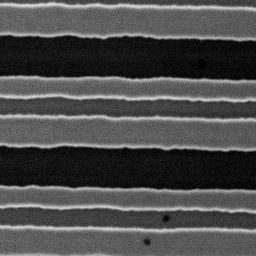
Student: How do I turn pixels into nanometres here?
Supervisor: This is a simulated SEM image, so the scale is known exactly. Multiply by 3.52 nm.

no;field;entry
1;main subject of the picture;lines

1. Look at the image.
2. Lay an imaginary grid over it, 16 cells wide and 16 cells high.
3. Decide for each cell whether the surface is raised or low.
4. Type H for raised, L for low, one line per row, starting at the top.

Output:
HHHHHHHHHHHHHHHH
HHHHHHHHHHHHHHHH
LLLLLLLLLLLLLLLL
LLLLLLLLLLLLLLLL
LLLLLLLLLLLLLLLL
HHHHHHHHHHHHHHHH
HHHHHHHHHHHHHHHH
HHHHHHHHHHHHHHHH
HHHHHHHHHHHHHHHH
LLLLLLLLLLLLLLLL
LLLLLLLLLLLLLLLL
LLLLLLLLLLLLLLLL
HHHHHHHHHHHHHHHH
HHHHHHHHHHHHHHHH
HHHHHHHHHHHHHHHH
HHHHHHHHHHHHHHHH